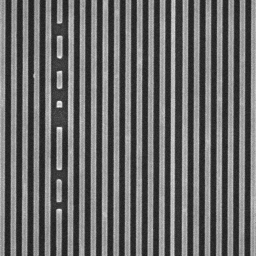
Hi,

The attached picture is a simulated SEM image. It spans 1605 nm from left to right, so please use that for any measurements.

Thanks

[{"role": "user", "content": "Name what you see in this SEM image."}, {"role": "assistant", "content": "parallel lines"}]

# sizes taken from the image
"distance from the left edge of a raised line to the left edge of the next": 71.6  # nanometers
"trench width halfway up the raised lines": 6.75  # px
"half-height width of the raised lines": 4.99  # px